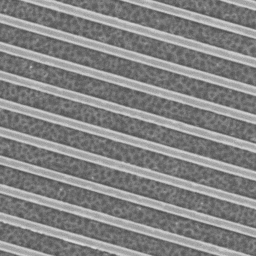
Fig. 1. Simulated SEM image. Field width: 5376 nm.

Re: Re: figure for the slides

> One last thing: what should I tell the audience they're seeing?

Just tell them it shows parallel lines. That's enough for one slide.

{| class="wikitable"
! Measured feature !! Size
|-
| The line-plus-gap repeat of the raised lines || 0.574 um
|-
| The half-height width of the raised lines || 146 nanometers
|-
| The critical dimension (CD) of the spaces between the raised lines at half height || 20.2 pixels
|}